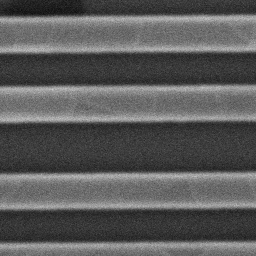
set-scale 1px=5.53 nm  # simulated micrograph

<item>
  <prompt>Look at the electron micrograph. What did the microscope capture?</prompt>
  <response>wiring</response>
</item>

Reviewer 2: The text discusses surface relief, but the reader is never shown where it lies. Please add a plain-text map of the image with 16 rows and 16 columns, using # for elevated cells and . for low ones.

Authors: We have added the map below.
................
################
################
................
................
..##############
################
##..............
................
................
................
################
################
................
................
################